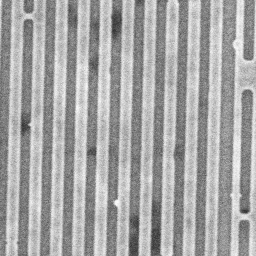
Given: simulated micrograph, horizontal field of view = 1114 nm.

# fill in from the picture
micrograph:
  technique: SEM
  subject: parallel lines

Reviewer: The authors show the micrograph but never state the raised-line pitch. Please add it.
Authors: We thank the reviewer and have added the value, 96.9 nm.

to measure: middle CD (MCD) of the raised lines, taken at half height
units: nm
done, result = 48.4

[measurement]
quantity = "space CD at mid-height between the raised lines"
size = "47.9 nm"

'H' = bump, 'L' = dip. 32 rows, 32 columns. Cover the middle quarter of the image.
HLLHHHLLLHHLLLHHHLLLHHHLLHHHLLLH
LLLHHHLLLHHLLLHHHLLLHHHLLHHHLLLH
LLLHHHLLLHHLLLHHHLLLHHHLLHHHLLLH
LLLHHHLLLHHLLLHHHLLLHHHLLHHHLLLH
LLLHHHLLLHHLLLHHHLLLHHHLLHHHLLLH
LLLHHHLLLHHLLLHHHLLLHHHLLHHHLLLH
LLLHHHLLLHHLLLHHHLLLHHLLLHHHLLLH
LLLHHHLLLHHLLLHHHLLLHHLLLHHHLLLH
LLLHHHLLLHHLLLHHHLLLHHLLLHHHLLLH
LLLHHHLLLHHLLLHHHLLLHHLLLHHHLLLH
LLLHHHLLLHHLLLHHHLLLHHLLLHHHLLLH
LLLHHHLLLHHLLLHHHLLLHHLLLHHHLLLH
LLLHHHLLLHHLLLHHHLLLHHLLLHHHLLLH
LLLHHHLLLHHLLLHHHLLLHHLLLHHHLLLH
LLLHHHLLHHHLLLHHHLLLHHLLLHHHLLLH
LLLHHLLLHHHLLLHHHLLLHHLLLHHHLLLH
LLLHHLLLHHHLLLHHHLLLHHLLLHHHLLLH
LLLHHLLLHHHLLLHHHLLHHHLLLHHHLLLH
LLLHHLLLHHHLLLHHHLLHHHLLLHHHLLLH
LLLHHLLLHHHLLLHHHLLHHHLLLHHHLLHH
LLLHHLLLHHHLLLHHHLLHHHLLLHHHLLHH
LLLHHLLLHHHLLLHHHLLHHHLLLHHLLLHH
LLLHHLLLHHHLLLHHHLLHHHLLLHHLLLHH
LLLHHLLLHHHLLLHHHLLHHHLLLHHLLLHH
LLLHHLLLHHHLLLHHHLLHHHLLLHHLLLHH
LLLHHLLLHHHLLLHHHLLHHHLLLHHHLLHH
LLLHHLLLHHHLLLHHLLLHHHLLLHHHLLHH
LLLHHLLLHHHLLLHHLLLHHHLLLHHHLLHH
LLLHHLLLHHHLLLHHLLLHHHLLLHHLLLHH
LLLHHLLLHHHLLLHHLLLHHHLLLHHLLLHH
LLLHHLLLHHHLLLHHLLLHHHLLLHHLLLHH
LLLHHLLLHHHLLLHHLLLHHHLLLHHLLLHH